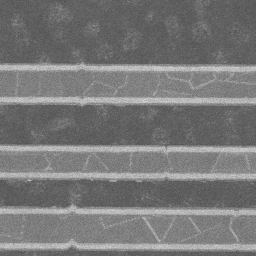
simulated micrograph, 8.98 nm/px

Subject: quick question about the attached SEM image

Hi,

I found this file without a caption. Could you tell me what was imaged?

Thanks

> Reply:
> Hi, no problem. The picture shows one or a few lines or trenches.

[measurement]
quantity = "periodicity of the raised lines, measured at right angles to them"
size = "0.65 µm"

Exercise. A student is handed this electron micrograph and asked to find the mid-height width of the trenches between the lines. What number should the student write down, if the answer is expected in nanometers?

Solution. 382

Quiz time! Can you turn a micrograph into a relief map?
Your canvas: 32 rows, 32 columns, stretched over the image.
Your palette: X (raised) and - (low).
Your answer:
--------------------------------
--------------------------------
--------------------------------
--------------------------------
--------------------------------
--------------------------------
--------------------------------
--------------------------------
XXXXX-XXXXXX--------------------
XXXXXXXXXXXXXXXXXXXXXXXXXXXXXXXX
XXXXXXXXXXXXXXXXXXXXXXXXXXXXXXXX
XXXXXXXXXXXXXXXXXXXXXXXXXXXXXXXX
---X-----XX----XXXXXXXXXXXXXXXXX
--------------------------------
--------------------------------
--------------------------------
--------------------------------
--------------------------------
--------------------------------
XXXXXXXXXXXXXXXXXXXXXXXXXXXXXXXX
XXXXXXXXXXXXXXXXXXXXXXXXXXXXXXXX
XXXXXXXXXXXXXXXXXXXXXXXXXXXXXXXX
--------------------------------
--------------------------------
--------------------------------
--------------------------------
XXXXXXXXXXXXXX------------------
XXXXXXXXXXXXXXXXXXXXXXXXXXXXXXXX
XXXXXXXXXXXXXXXXXXXXXXXXXXXXXXXX
XXXXXXXXXXXXXXXXXXXXXXXXXXXXXXXX
XXXXXXXXXXXXXXXXXXXXXXXXXXXXXXXX
--------------------------------